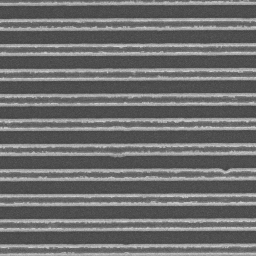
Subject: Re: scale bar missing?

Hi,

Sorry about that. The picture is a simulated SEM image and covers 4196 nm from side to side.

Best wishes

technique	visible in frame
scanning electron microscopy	parallel lines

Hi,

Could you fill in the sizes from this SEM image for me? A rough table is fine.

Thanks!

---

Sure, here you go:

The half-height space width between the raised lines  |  252 nm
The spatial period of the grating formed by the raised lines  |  411 nm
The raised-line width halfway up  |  0.164 micrometres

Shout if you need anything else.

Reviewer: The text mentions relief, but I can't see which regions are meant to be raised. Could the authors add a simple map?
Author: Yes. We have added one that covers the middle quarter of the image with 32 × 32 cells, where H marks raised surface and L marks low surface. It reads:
LLLLLLLLLLLLLLLLLLLLLLLLLLLLLLLL
LLLLLLLLLLLHHHHHHHHHHHHHHHHHHHHH
HHHHHHHHHHHHHHHHHHHHHHHHHHHHHHHH
HHHHHHHHHHHHHHHHHHHHHHHHHHHHHHHH
LLLLLLLLLLLLLLLLLLLLLLLLLLLLLLLL
LLLLLLLLLLLLLLLLLLLLLLLLLLLLLLLL
LLLLLLLLLLLLLLLLLLLLLLLLLLLLLLLL
LLLLLLLLLLLLLLLLLLLLLLLLLLLLLLLL
HHHHHHHHHHHHHHHHHHHHHHHHHHHHHHHH
HHHHHHHHHHHHHHHHHHHHHHHHHHHHHHHH
LLLLLLLLLLLLLLLLLLLLLLLLLLLLLLLL
LLLLLLLLLLLLLLLLLLLLLLLLLLLLLLLL
LLLLLLLLLLLLLLLLLLLLLLLLLLLLLLLL
LLLLLLLLLLLLLLLLLLLLLLLLLLLLLLLL
HHHHHHHHHHHHHHHHHHHHHHHHHHHHHHHH
HHHHHHHHHHHHHHHHHHHHHHHHHHHHHHHH
LLLLLLLLLLLLLLLLLLLLLLLLLLLLLLLL
LLLLLLLLLLLLLLLLLLLLLLLLLLLLLLLL
LLLLLLLLLLLLLLLLLLLLLLLLLLLLLLLL
LLLLLLLLLLLLLLLLLLLLLLLLLLLLLLLL
HHHHHHHHHHHHHHHHHHHHHHHHHHHHHHHH
HHHHHHHHHHHHHHHHHHHHHHHHHHHHHHHH
HHHHHHHHHHHHHHHHLLLLLLLLLLLLLLLL
LLLLLLLLLLLLLLLLLLLLLLLLLLLLLLLL
LLLLLLLLLLLLLLLLLLLLLLLLLLLLLLLL
LLLLLLLLLLLLLLLLLLLLLLLLLLLLLLLL
LLLLLLLLLLLLLLLLLLLLLLLLLLLLLLLL
HHHHHHHHHHHHHHHHHHHHHHHHHHHHHHHH
HHHHHHHHHHHHHHHHHHHHHHHHHHHHHHHH
LLLLLLLLLLLLLLLLLLLLLLLLLLLLLLLL
LLLLLLLLLLLLLLLLLLLLLLLLLLLLLLLL
LLLLLLLLLLLLLLLLLLLLLLLLLLLLLLLL